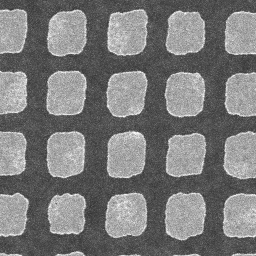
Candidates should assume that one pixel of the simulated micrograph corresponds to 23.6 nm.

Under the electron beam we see a regular array of raised bodies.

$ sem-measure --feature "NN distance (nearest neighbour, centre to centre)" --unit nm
1390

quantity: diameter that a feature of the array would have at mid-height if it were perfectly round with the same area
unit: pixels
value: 43.8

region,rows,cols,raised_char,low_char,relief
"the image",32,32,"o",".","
................................
ooo......o......oo....o.........
ooo...ooooo...oooo...oooo....ooo
ooo...ooooo...oooo...ooooo..oooo
ooo...ooooo...oooo...ooooo..oooo
ooo...ooooo...oooo...oooo...oooo
oo....oooo....ooo....ooo.....ooo
................................
................................
ooo...oooo....oooo...oooo....ooo
ooo...ooooo...oooo...oooo...oooo
ooo...ooooo..ooooo...ooooo..oooo
ooo...ooooo..ooooo...oooo...oooo
ooo...oooo....oooo...oooo...oooo
..............oo......o.........
................................
................o...............
ooo...oooo....oooo...ooooo..oooo
ooo...oooo....oooo...ooooo..oooo
ooo...oooo....oooo...ooooo..oooo
ooo...oooo...ooooo...oooo...oooo
ooo...oooo....oooo...oooo...oooo
................................
................................
ooo.....oo....oooo....ooo....ooo
ooo....oooo...oooo...ooooo..oooo
ooo...oooo...ooooo...ooooo..oooo
ooo...oooo...ooooo...oooo...oooo
ooo...oooo...ooooo...oooo...oooo
..............o......ooo.....ooo
................................
................................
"